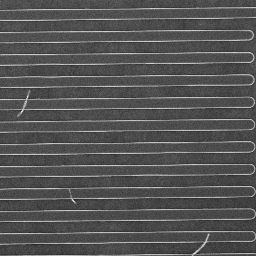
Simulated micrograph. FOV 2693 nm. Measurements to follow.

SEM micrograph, groups of lines, slits or small figures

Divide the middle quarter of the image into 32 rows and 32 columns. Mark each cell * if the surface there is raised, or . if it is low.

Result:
................................
................................
................................
********************************
********************************
************....................
................................
................................
...............................*
********************************
********************************
................................
................................
................................
********************************
********************************
********************************
................................
................................
................................
********************************
********************************
................................
................................
................................
............********************
********************************
********************************
................................
................................
................................
********************************